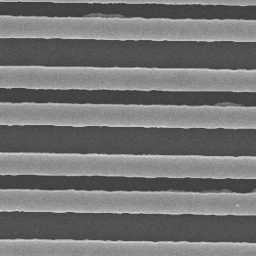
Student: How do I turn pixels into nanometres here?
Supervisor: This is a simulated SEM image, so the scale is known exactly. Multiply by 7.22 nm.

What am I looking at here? lines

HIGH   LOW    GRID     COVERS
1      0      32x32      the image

00000000000000000000111111111111
00000000000000000000000000000000
11111111111111111111111101111000
11111111111111111111111111111111
11111111111111111111111111111111
00000000000000000000000000000000
00000000000000000000000000000000
00000000000000000000000000000000
11111111111111111110000000000000
11111111111111111111111111111111
11111111111111111111111111111111
00000000000000000000000000000000
00000000000000000000000000000000
11111111111111111111111111111111
11111111111111111111111111111111
11111111111111111111111111111111
00000000000000000000000000000000
00000000000000000000000000000000
00000000000000000000000000000000
11111111111111111111110100000000
11111111111111111111111111111111
11111111111111111111111111111111
00000000000000000000000000000000
00000000000000000000000000000000
11111111111111111111111111111111
11111111111111111111111111111111
00000011111111111111111111111111
00000000000000000000000000000000
00000000000000000000000000000000
00000000000000000000000000000000
11111111111111111111111111111111
11111111111111111111111111111111